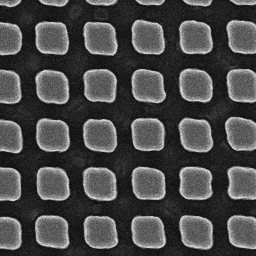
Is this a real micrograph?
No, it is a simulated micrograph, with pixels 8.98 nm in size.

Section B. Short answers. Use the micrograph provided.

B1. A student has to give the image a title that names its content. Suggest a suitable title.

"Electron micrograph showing a regular array of raised bodies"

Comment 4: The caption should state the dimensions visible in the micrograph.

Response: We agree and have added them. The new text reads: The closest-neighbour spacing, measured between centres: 0.426 µm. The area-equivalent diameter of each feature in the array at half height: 314 nm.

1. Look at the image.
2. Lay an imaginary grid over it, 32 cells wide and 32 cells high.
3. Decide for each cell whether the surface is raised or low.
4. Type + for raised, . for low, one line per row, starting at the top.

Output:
++....++...+++....++....++....++
................................
................................
++...+++...+++...+++..++++..++++
+++..+++...+++...+++...+++...+++
+++..++++..++++..++++..++++..+++
++...+++...++++..+++...+++...+++
................................
................................
++...+++...+++...+++...+++..++++
++...++++..++++..+++..+++++.++++
+++..++++..+++...++++..++++..+++
++...+++...+++...+++....++...+++
................................
................................
++...+++...+++...+++..++++..++++
+++..++++.+++++..+++..++++..++++
+++..++++.+++++..+++...++++.++++
+++..+++...+++...+++...+++...+++
................................
................................
++...+++...+++...+++...+++...+++
+++..++++.++++..+++++.++++...+++
+++..++++.++++...++++.++++...+++
++...++++..+++...+++...+++...+++
................................
................................
++...+++...+++...+++...+++...+++
+++.++++...+++..++++..++++..++++
+++.++++...++++..++++..+++...+++
+++..+++...++++..++++..+++...+++
................................